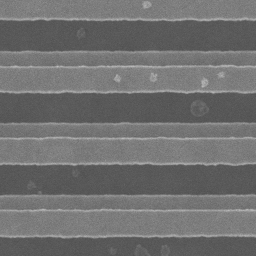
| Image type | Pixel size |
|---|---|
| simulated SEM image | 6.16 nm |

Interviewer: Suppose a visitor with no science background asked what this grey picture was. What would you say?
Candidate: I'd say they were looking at lines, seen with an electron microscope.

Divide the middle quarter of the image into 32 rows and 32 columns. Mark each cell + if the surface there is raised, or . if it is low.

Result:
++++++++++++++++++++++++++++++++
++++++++++++++++++++++++++++++++
++++++++++++++++++++++++++++++++
++++++++++++++++++++++++++++++++
++++++++++++++++++++++++++++++++
++++++++++++++++++++++++++++++++
++++++++++++++++++++++++++++++++
................................
................................
................................
................................
................................
................................
................................
................................
++++++++++++++++++++++++++++++++
++++++++++++++++++++++++++++++++
++++++++++++++++++++++++++++++++
++++++++++++++++++++++++++++++++
++++++++++++++++++++++++++++++++
++++++++++++++++++++++++++++++++
++++++++++++++++++++++++++++++++
++++++++++++++++++++++++++++++++
++++++++++++++++++++++++++++++++
++++++++++++++++++++++++++++++++
................................
................................
................................
................................
................................
................................
................................